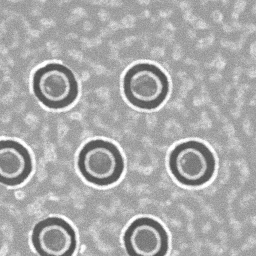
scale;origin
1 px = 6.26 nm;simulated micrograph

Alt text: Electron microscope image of ring-shaped grooves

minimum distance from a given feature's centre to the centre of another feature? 552 nm